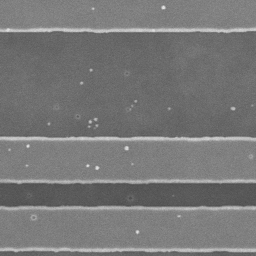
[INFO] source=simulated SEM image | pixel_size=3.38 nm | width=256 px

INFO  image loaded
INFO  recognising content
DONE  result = lines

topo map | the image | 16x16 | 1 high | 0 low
1111111111111111
1111111111111111
0000000000000000
0000000000000000
0000000000000000
0000000000000000
0000000000000000
0000000000000000
0000000000000000
1111111111111111
1111111111111111
0000000000000000
0000000000000000
1111111111111111
1111111111111111
1111111111111111